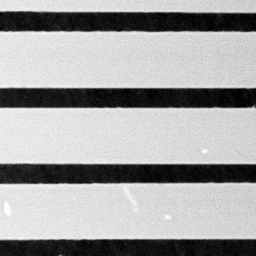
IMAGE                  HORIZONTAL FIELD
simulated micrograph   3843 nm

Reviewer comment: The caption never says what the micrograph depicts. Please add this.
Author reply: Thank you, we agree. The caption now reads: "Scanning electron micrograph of lines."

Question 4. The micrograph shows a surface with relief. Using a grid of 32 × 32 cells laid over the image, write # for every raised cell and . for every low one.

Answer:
################################
..................#...##########
................................
................................
################################
################################
################################
################################
################################
################################
################################
................................
................................
..............#......##...##...#
################################
################################
################################
################################
################################
################################
................................
................................
................................
################################
################################
################################
################################
################################
################################
################################
................................
................................